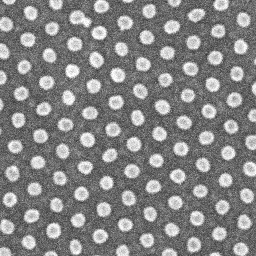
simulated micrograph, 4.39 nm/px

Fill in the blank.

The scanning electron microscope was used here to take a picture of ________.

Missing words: a regular array of raised bodies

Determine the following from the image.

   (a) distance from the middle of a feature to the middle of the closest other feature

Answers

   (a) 116 nanometers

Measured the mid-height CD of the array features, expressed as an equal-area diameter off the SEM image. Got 56.8 nm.